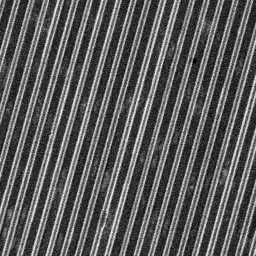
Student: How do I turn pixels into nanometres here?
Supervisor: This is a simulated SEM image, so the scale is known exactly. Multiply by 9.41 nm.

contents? parallel lines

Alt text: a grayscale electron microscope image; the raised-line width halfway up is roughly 4.7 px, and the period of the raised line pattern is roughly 132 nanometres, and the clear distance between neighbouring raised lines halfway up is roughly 0.0885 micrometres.